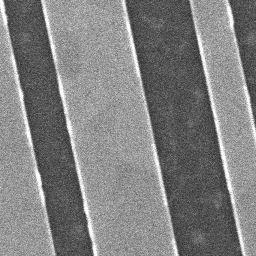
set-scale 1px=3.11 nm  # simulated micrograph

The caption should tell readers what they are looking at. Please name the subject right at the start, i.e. one or a few lines or trenches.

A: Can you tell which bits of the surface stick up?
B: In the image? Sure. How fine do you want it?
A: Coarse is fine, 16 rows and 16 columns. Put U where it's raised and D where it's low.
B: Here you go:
DDDUUUUUDDDDUUDD
DDDUUUUUDDDDUUUD
UDDUUUUUDDDDUUUD
UDDUUUUUDDDDDUUD
UDDDUUUUUDDDDUUD
UDDDUUUUUDDDDUUD
UDDDUUUUUDDDDUUU
UUDDUUUUUDDDDUUU
UUDDUUUUUUDDDDUU
UUDDDUUUUUDDDDUU
UUDDDUUUUUDDDDUU
UUUDDUUUUUDDDDUU
UUUDDUUUUUDDDDUU
UUUDDUUUUUUDDDDU
UUUDDDUUUUUDDDDU
UUUDDDUUUUUDDDDU